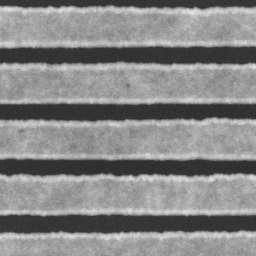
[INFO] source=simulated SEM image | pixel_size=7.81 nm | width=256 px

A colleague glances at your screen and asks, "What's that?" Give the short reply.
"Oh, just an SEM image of lines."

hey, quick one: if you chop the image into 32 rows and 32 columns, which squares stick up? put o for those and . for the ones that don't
................................
oooooooooooooooooooooooooooooooo
oooooooooooooooooooooooooooooooo
oooooooooooooooooooooooooooooooo
oooooooooooooooooooooooooooooooo
oooooooooooooooooooooooooooooooo
................................
................................
oooooooooooooooooooooooooooooooo
oooooooooooooooooooooooooooooooo
oooooooooooooooooooooooooooooooo
oooooooooooooooooooooooooooooooo
oooooooooooooooooooooooooooooooo
................................
................................
oooooooooooooooooooooooooooooooo
oooooooooooooooooooooooooooooooo
oooooooooooooooooooooooooooooooo
oooooooooooooooooooooooooooooooo
oooooooooooooooooooooooooooooooo
................................
................................
oooooooooooooooooooooooooooooooo
oooooooooooooooooooooooooooooooo
oooooooooooooooooooooooooooooooo
oooooooooooooooooooooooooooooooo
oooooooooooooooooooooooooooooooo
................................
................................
oooooooooooooooooooooooooooooooo
oooooooooooooooooooooooooooooooo
oooooooooooooooooooooooooooooooo